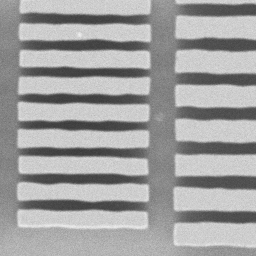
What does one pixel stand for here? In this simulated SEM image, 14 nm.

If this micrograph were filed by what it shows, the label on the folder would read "groups of lines, slits or small figures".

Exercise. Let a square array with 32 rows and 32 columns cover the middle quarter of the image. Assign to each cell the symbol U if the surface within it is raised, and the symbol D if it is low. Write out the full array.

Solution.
DUUUUUUUUUUUUUUUUUUUUDDDDDDDUUUU
DDDDDDDDDDDDDDDDDDDDDDDDDDDDUUUU
DDDDDDDDDDDDDDDDDDDDDDDDDDDDDDDD
UUUUUUUUUUUUUUUUDDUUUDDDDDDDDDDD
UUUUUUUUUUUUUUUUUUUUUDDDDDDDDDDD
UUUUUUUUUUUUUUUUUUUUUDDDDDDDUUUU
UUUUUUUUUUUUUUUUUUUUUDDDDDDDUUUU
DDDUUUDDDDUUUUUDDDUUUDDDDDDDUUUU
DDDDDDDDDDDDDDDDDDDDDDDDDDDDUUUU
DDDDDDDDDDDDDDDDDDDDDDDDDDDDUUUU
UUUUUUUUUUUUUUUUUUUUUDDDDDDDUUDD
UUUUUUUUUUUUUUUUUUUUUDDDDDDDDDDD
UUUUUUUUUUUUUUUUUUUUUDDDDDDDDDDD
UUUUUUUUUUUUUUUUUUUUUDDDDDDDDDDD
DDDDDDDDDDDDDDDDDDDDDDDDDDDDUUUU
DDDDDDDDDDDDDDDDDDDDDDDDDDDDUUUU
DDDDDDDDDDDDDDDDDDDDDDDDDDDDUUUU
UUUUUUUUUUUUUUUUUUUUUDDDDDDDUUUU
UUUUUUUUUUUUUUUUUUUUUDDDDDDDUUUU
UUUUUUUUUUUUUUUUUUUUUDDDDDDDDDDD
UUUUUUUUUUUUUUUUUUUUUDDDDDDDDDDD
DDDDDDDDDDDDDDDDDDDDDDDDDDDDDDDD
DDDDDDDDDDDDDDDDDDDDDDDDDDDDDDDD
UUUUUUUUUUUUUUDDDDDDDDDDDDDDUUUU
UUUUUUUUUUUUUUUUUUUUUDDDDDDDUUUU
UUUUUUUUUUUUUUUUUUUUUDDDDDDDUUUU
UUUUUUUUUUUUUUUUUUUUUDDDDDDDUUUU
DDDDDDDDDDDDDDUUUUUUUDDDDDDDUUUU
DDDDDDDDDDDDDDDDDDDDDDDDDDDDDDDD
DDDDDDDDDDDDDDDDDDDDDDDDDDDDDDDD
UUUUUUUUUUUUUUUUUUUUUDDDDDDDDDDD
UUUUUUUUUUUUUUUUUUUUUDDDDDDDUUUU